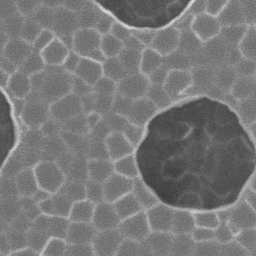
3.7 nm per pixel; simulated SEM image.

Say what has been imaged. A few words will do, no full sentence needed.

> holes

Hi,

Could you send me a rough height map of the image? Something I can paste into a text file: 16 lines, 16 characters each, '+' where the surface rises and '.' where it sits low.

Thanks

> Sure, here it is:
+++++++.....++++
++++++++..++++++
++++++++++++++++
++++++++++++++++
++++++++++++++++
++++++++++++++++
.++++++++++...++
.++++++++......+
.++++++++.......
.++++++++.......
+++++++++.......
+++++++++......+
++++++++++.....+
++++++++++++++++
++++++++++++++++
++++++++++++++++